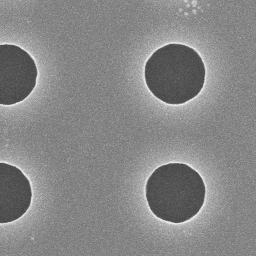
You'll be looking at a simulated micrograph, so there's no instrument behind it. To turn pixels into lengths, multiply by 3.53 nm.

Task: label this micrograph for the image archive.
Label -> holes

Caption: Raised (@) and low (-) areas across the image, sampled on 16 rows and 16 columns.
@@@@@@@@@@@@@@@@
@@@@@@@@@@@@@@@@
@@@@@@@@@@@@@@@@
--@@@@@@@---@@@@
--@@@@@@@----@@@
--@@@@@@@----@@@
-@@@@@@@@@@@@@@@
@@@@@@@@@@@@@@@@
@@@@@@@@@@@@@@@@
@@@@@@@@@@@@@@@@
-@@@@@@@@@--@@@@
--@@@@@@@----@@@
--@@@@@@@----@@@
-@@@@@@@@@--@@@@
@@@@@@@@@@@@@@@@
@@@@@@@@@@@@@@@@